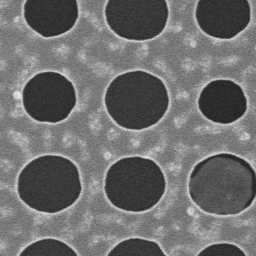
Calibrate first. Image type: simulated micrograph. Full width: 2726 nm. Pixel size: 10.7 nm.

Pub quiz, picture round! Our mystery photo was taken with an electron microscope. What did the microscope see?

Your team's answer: holes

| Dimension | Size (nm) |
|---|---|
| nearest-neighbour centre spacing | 908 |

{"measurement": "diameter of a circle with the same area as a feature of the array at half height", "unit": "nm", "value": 622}